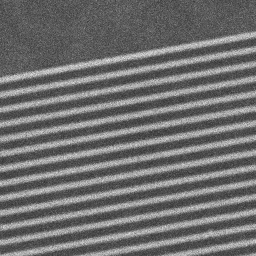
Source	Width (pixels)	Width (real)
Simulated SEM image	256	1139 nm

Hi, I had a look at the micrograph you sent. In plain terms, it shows parallel lines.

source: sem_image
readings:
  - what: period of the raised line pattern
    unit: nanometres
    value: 64.7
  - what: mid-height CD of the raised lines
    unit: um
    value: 0.0224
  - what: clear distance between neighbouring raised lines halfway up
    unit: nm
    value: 41.1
